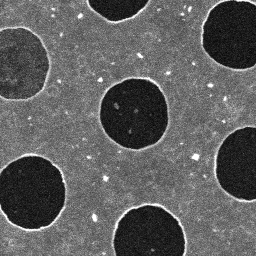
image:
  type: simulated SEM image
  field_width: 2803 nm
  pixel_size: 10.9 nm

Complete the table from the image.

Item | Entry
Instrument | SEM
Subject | holes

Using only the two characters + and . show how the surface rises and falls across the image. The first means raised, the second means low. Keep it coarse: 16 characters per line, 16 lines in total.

++++++...++++...
+++++++++++++...
..+++++++++++...
...++++++++++...
...+++++++++++++
...++++...++++++
++++++....++++++
++++++....++++++
+++++++...++++..
++++++++++++++..
....+++++++++...
....++++++++++..
....+++++++++++.
....++++...+++++
+++++++....+++++
+++++++.....++++